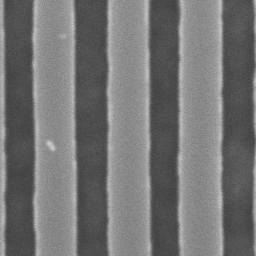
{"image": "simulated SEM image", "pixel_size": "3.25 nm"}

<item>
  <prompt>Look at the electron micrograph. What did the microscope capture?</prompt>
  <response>lines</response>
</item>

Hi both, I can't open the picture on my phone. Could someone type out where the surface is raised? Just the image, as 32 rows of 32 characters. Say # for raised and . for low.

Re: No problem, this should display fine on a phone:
....#####.....####.....#####....
....#####.....####.....#####....
....#####.....####.....#####....
....#####....#####....######....
....#####.....####....######....
....#####.....####....######....
....#####....######...######....
....#####.....#####...######....
....#####.....#####...######....
....#####.....#####...######....
....#####.....#####...######....
....#####....######...######....
....#####.....#####...######....
....#####.....#####...######....
....#####.....#####...######....
....#####.....#####...######....
#...#####.....#####...######....
#...#####.....#####...######....
....#####.....#####...######....
#...#####.....#####...######....
#...#####.....#####...######....
#...#####.....#####...######....
#...#####....######...######....
#...#####....######...######....
....#####.....#####...######....
#...#####.....#####...######....
#...#####.....#####...######....
#...#####.....#####...######....
#...#####.....#####...######....
.....####....######...######....
#....####.....#####...######....
#....####.....#####....#####....